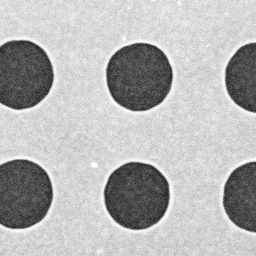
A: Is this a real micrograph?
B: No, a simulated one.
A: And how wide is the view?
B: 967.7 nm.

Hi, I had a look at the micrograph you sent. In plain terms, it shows holes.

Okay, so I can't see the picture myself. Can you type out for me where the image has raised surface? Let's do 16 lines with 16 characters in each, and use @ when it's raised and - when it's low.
@@@@@@@@@@@@@@@@
@@@@@@@@@@@@@@@@
@@@@@@@@@@@@@@@@
---@@@@---@@@@@-
---@@@@----@@@--
---@@@@----@@@--
--@@@@@---@@@@@-
@@@@@@@@@@@@@@@@
@@@@@@@@@@@@@@@@
@@@@@@@@@@@@@@@@
---@@@@---@@@@@-
---@@@@----@@@--
---@@@@----@@@--
---@@@@---@@@@--
@@@@@@@@@@@@@@@@
@@@@@@@@@@@@@@@@